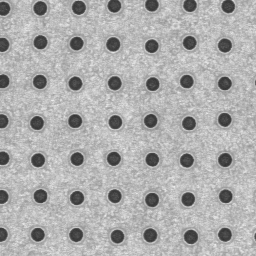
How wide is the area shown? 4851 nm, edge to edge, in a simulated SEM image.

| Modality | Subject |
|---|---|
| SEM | a regular array of holes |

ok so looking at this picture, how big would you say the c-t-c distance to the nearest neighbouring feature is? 680 nm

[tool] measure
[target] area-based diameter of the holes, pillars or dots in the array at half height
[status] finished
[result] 0.267 µm